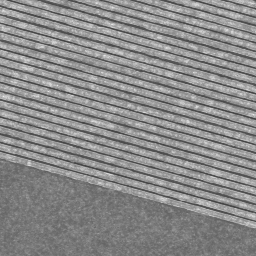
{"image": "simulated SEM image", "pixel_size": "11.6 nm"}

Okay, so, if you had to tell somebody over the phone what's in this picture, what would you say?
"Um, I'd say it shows parallel lines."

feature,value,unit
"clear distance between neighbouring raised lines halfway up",2.41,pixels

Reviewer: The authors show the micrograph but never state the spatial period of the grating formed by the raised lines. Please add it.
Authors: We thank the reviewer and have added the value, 0.0949 micrometres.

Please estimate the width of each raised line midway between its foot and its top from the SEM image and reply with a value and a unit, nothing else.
71.3 nm